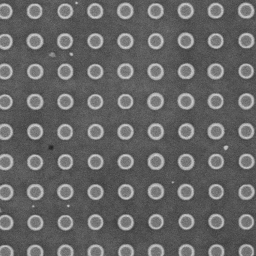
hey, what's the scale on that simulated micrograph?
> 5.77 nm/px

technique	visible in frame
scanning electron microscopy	an array of small figures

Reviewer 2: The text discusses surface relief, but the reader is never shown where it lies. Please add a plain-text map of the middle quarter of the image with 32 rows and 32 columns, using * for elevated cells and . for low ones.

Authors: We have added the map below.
**.....**.....***....***.....***
**....****...****....****....***
**....****...****....****....***
**.....**.....**......**.....***
................................
................................
................................
......................**.....**.
**....****....***....****....***
**....****....***....****...****
**....****....***....****....***
................................
................................
................................
................................
*......**.....***....***.....***
**....****...****....****....***
**....****...****....****....***
**.....**.....***.....**.....***
................................
................................
................................
......................**........
**....****....***....****....***
**....****...****....****....***
**....****....***....****....***
................................
................................
................................
................................
**.....**.....***.....**.....***
**....****....***....****...****